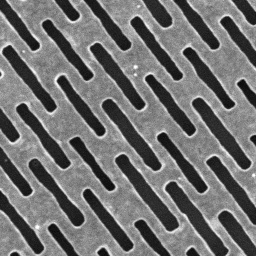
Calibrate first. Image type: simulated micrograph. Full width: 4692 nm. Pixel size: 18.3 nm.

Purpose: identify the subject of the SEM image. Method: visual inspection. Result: a regular array of holes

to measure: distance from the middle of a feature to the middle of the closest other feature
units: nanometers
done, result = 865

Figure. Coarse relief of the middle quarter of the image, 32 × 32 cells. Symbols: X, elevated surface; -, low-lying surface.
XX----XXX-----XXXXXXXXXXX---XXXX
XXX----XXX----XXXXXXXXXXXX---XXX
XXXX---XXXX----XXXXXXXXXXX----XX
-XXXX--XXXXX----XXXX---XXXX---XX
-XXXXXXXXXXXX----XXXX---XXXXXXXX
--XXXXXXXXXXX----XXXX----XXXXXXX
---XXXXXXXXXXX----XXXX----XXXXXX
----XXXXXXXXXXX----XXXX----XXXXX
X---XXXXXXXXXXXX---XXXX----XXXXX
X----XXXXX---XXXX---XXXX----XXXX
XX----XXX----XXXX---XXXXX----XXX
XXX----XXX----XXXX-XXXXXXX----XX
XXXX----XXX----XXXXXXXXXXX----XX
XXXXX----XX-----XXXXXXXXXXX----X
XXXXX----XXX-----XXXXXXXXXXX----
XXXXXX----XXX----XXXXXXXXXXXX---
XXXXXXX---XXXX----XXXXXXXXXXXX--
XXXXXXXX--XXXXX----XXXXX--XXXXX-
XX--XXXXXXXXXXX-----XXX---XXXXXX
X----XXXXXXXXXXX-----XXX---XXXXX
XX---XXXXXXXXXXXX----XXXX---XXXX
XX----XXXXXXXXXXXX----XXXX---XXX
XXXX---XXXXXXX-XXX-----XXX----XX
-XXX----XXXXX---XXX----XXXX---XX
--XXX---XXXXX----XXX----XXXX---X
-XXXXX---XXXX----XXXX---XXXX----
XXXXXXX---XXXX----XXXX--XXXXX---
XXXXXXX---XXXXX----XXXXXXXXXXX--
XXXXXXXX---XXXXX----XXXXXXXXXX--
XXXXXXXXX---XXXX-----XXXXXX-XXX-
XXXXXXXXXX---XXXX----XXXX----XXX
XXXXX--XXXX--XXXXX----XXX-----XX